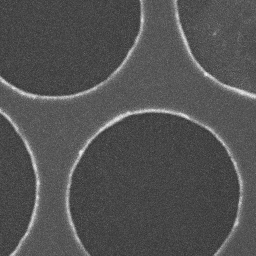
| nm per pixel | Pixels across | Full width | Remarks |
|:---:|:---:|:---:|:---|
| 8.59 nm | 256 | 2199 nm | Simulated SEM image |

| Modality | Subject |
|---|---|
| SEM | holes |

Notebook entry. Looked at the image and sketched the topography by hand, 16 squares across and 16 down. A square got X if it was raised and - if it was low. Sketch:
---------XX-XXXX
---------XXXXXXX
--------XXXXXXXX
--------XXXXXXXX
-------XXXXXXXXX
X-----XXXXXXXXX-
XXXXXXXXXXXXXXXX
-XXXXXX-----XXXX
-XXXXX-------XXX
--XXX---------XX
--XXX----------X
--XX-----------X
--XX-----------X
--XX-----------X
--XXX---------XX
-XXXX---------XX